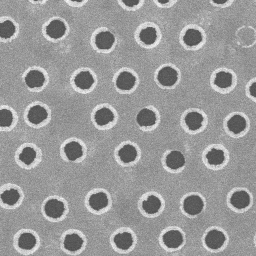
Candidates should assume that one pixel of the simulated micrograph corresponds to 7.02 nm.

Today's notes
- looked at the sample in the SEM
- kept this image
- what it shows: a regular array of holes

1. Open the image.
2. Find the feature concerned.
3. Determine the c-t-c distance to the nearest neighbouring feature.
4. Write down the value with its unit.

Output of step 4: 290 nm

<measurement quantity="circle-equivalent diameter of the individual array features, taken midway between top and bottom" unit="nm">131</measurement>